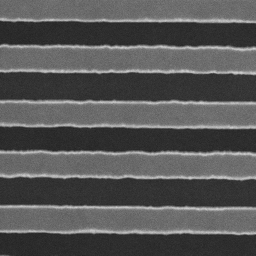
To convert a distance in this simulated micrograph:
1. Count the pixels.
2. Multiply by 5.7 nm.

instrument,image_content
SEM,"lines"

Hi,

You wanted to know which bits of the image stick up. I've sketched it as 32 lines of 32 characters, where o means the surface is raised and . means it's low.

oooooooooooooooooooooooooooooooo
oooooooooooooooooooooooooooooooo
oooooooooooooooooooooooooooooooo
................................
................................
................................
oooooooooooooooooooooooooooooooo
oooooooooooooooooooooooooooooooo
oooooooooooooooooooooooooooooooo
................................
................................
................................
................................
oooooooooooooooooooooooooooooooo
oooooooooooooooooooooooooooooooo
oooooooooooooooooooooooooooooooo
................................
................................
................................
oooooooooooooooooooooooooooooooo
oooooooooooooooooooooooooooooooo
oooooooooooooooooooooooooooooooo
................................
................................
................................
................................
oooooooooooooooooooooooooooooooo
oooooooooooooooooooooooooooooooo
oooooooooooooooooooooooooooooooo
................................
................................
................................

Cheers